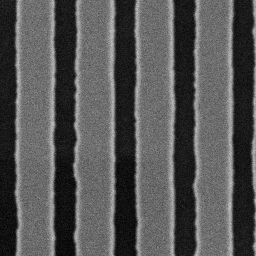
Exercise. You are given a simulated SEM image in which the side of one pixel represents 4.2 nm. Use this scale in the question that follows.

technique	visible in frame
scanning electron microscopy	lines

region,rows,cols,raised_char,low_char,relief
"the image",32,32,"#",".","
..#####...####...#####..#####...
..#####...####...#####..#####...
..#####...####...#####..#####...
..#####...####...#####...####...
..#####...####...#####...####...
..#####...####...#####..#####...
..#####...####...#####..#####...
..#####..#####...#####..#####...
..#####..#####...#####..#####...
..#####...####...#####..#####...
..#####..#####...#####..#####...
..#####...####...#####..#####...
..#####..#####...#####..#####...
..#####..#####...#####..#####...
..#####..#####...#####..#####...
..#####..#####...#####..#####...
..#####...####...#####..#####...
..#####...####...#####..#####...
..#####..#####...#####..#####...
..#####..#####...#####..#####...
..#####..#####...#####...####...
..#####..#####...#####...####...
..#####...####...#####..#####...
..#####...####...#####..#####...
..#####...####...#####..#####...
..#####...####...#####...####...
..#####...####...#####...####...
..#####...####...#####..#####...
..#####...####...#####...####...
..#####..#####...#####...####...
..#####..#####...#####...####...
..#####...####...#####..#####...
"